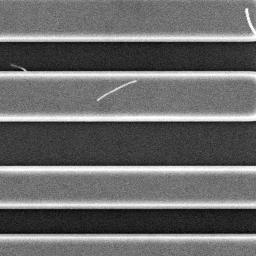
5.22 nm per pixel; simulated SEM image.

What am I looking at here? groups of lines, slits or small figures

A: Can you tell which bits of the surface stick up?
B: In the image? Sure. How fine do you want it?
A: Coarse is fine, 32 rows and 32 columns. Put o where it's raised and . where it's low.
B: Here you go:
oooooooooooooooooooooooooooooooo
oooooooooooooooooooooooooooooooo
oooooooooooooooooooooooooooooooo
oooooooooooooooooooooooooooooooo
oooooooooooooooooooooooooooooooo
................................
................................
................................
................................
oooooooooooooooooooooooooooooooo
oooooooooooooooooooooooooooooooo
oooooooooooooooooooooooooooooooo
oooooooooooooooooooooooooooooooo
oooooooooooooooooooooooooooooooo
oooooooooooooooooooooooooooooooo
................................
................................
................................
................................
................................
................................
oooooooooooooooooooooooooooooooo
oooooooooooooooooooooooooooooooo
oooooooooooooooooooooooooooooooo
oooooooooooooooooooooooooooooooo
oooooooooooooooooooooooooooooooo
................................
................................
................................
................................
oooooooooooooooooooooooooooooooo
oooooooooooooooooooooooooooooooo